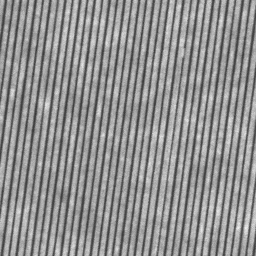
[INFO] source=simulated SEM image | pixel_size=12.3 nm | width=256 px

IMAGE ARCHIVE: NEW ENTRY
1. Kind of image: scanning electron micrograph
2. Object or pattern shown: parallel lines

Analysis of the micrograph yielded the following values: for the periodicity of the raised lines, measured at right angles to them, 90.2 nanometres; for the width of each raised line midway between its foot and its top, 5.21 px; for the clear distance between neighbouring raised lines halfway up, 2.6 pixels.